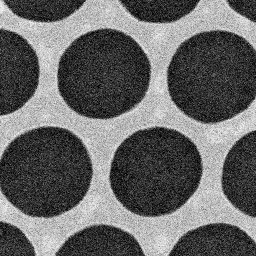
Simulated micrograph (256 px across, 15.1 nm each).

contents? holes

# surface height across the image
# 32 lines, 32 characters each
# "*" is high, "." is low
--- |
*.........*****..........****...
*........*******........*****...
***.....*********.....*********.
*************.******************
...*******......********......**
....*****........******........*
....****..........****..........
.....**............**...........
.....**............**...........
.....**............**...........
.....**............**...........
....***...........***...........
....****..........***...........
...******........*****.........*
**********.....********.......**
********************************
***......********......********.
*.........******........******..
*..........****..........****...
...........***...........***....
............**...........***....
............**...........***....
...........***...........***....
...........***...........***....
*..........***..........****....
*.........*****........******...
***.....********......********..
********************************
..********.....*********......**
...******........******........*
....****.........*****..........
....***...........***...........